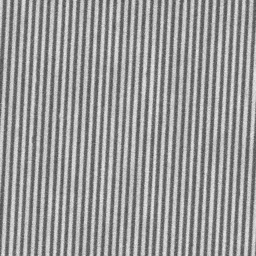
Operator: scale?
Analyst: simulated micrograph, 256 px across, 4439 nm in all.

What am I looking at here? parallel lines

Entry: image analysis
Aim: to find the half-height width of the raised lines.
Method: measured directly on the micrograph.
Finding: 58.4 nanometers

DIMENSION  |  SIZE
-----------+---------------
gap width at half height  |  73.6 nm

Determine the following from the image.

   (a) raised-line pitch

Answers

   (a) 7.35 px